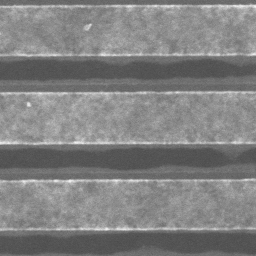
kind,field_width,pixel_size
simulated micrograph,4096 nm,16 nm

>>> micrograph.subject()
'lines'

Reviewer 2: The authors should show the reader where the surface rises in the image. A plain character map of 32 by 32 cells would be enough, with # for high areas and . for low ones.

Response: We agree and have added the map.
................................
################################
################################
################################
################################
################################
################################
................................
................................
................................
................................
............####################
################################
################################
################################
################################
################################
################################
................................
................................
................................
................................
..............................##
################################
################################
################################
################################
################################
################################
................................
................................
................................